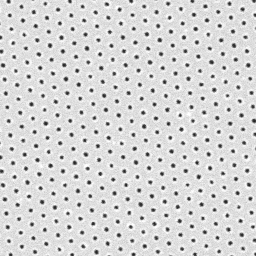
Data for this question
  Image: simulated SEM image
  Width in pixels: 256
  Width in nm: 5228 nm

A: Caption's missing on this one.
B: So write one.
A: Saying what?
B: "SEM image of a regular array of holes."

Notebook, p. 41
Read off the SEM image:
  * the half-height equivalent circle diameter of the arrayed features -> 100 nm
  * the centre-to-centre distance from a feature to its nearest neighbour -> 280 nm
